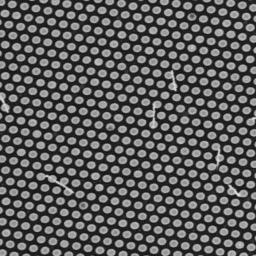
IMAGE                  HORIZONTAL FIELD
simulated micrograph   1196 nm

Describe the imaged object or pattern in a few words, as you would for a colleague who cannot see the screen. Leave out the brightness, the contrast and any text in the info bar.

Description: a regular array of raised bodies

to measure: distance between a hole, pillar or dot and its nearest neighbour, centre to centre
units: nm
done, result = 54.2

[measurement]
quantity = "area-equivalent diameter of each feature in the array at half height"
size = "0.038 micrometres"